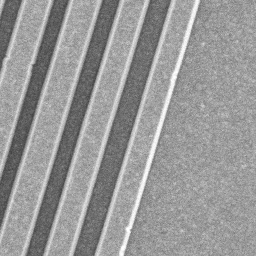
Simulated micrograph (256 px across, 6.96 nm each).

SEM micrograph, parallel lines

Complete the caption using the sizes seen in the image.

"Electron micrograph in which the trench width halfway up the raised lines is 138 nm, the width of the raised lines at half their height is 0.18 micrometres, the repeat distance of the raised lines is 332 nm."